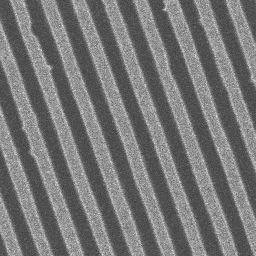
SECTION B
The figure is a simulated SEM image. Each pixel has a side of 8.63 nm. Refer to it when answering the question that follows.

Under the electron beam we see parallel lines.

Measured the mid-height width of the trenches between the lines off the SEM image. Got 113 nanometers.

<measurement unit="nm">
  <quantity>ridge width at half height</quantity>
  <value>135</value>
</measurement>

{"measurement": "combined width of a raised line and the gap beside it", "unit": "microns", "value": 0.25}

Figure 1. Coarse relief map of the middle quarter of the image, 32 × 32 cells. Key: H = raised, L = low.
HHHHLLLLHHHHLLLHHHHLLLLHHHHLLLHH
HHHHLLLLHHHHLLLHHHHHLLLHHHHLLLLH
HHHHHLLLHHHHLLLLHHHHLLLHHHHLLLLH
LHHHHLLLHHHHHLLLHHHHLLLLHHHHLLLH
LHHHHLLLLHHHHLLLHHHHHLLLHHHHLLLL
LHHHHHLLLHHHHLLLLHHHHLLLLHHHHLLL
LLHHHHLLLHHHHHLLLHHHHLLLLHHHHLLL
LLHHHHLLLLHHHHLLLHHHHHLLLHHHHLLL
LLLHHHHLLLHHHHHLLLHHHHLLLLHHHHLL
LLLHHHHLLLLHHHHLLLHHHHHLLLHHHHLL
LLLHHHHLLLLHHHHLLLLHHHHLLLHHHHLL
LLLLHHHHLLLHHHHHLLLHHHHLLLLHHHHL
LLLLHHHHLLLLHHHHLLLHHHHHLLLHHHHL
HLLLHHHHLLLLHHHHHLLLHHHHLLLHHHHH
HLLLLHHHHLLLHHHHHLLLHHHHLLLLHHHH
HHLLLHHHHLLLLHHHHLLLHHHHHLLLHHHH
HHLLLHHHHHLLLHHHHLLLLHHHHLLLHHHH
HHLLLLHHHHLLLHHHHHLLLHHHHLLLLHHH
HHHLLLHHHHLLLLHHHHLLLLHHHHLLLHHH
HHHLLLHHHHHLLLHHHHLLLLHHHHLLLLHH
HHHLLLLHHHHLLLLHHHHLLLHHHHLLLLHH
HHHHLLLHHHHHLLLHHHHLLLLHHHHLLLHH
HHHHLLLLHHHHLLLHHHHHLLLHHHHLLLLH
HHHHLLLLHHHHLLLLHHHHLLLHHHHLLLLH
HHHHHLLLHHHHLLLLHHHHLLLLHHHHLLLH
LHHHHLLLLHHHHLLLHHHHHLLLHHHHLLLH
LHHHHLLLLHHHHLLLLHHHHLLLHHHHHLLL
LHHHHHLLLHHHHLLLLHHHHLLLLHHHHLLL
LLHHHHLLLLHHHHLLLHHHHHLLLHHHHLLL
LLHHHHLLLLHHHHLLLLHHHHLLLHHHHLLL
LLHHHHHLLLHHHHLLLLHHHHLLLLHHHHLL
LLLHHHHLLLHHHHHLLLHHHHHLLLHHHHLL